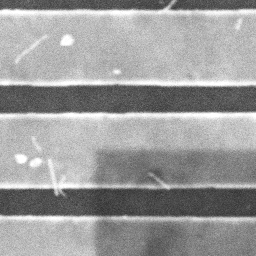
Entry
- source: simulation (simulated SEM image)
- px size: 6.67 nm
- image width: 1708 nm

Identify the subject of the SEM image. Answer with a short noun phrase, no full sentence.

lines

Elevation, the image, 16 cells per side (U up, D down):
DDDDDDDDDDDDDDDD
UUUUUUUUUUUUUUUU
UUUUUUUUUUUUUUUU
UUUUUUUUUUUUUUUU
UUUUUUUUUUUUUUUU
DDDDDDDDDDDDDDDD
DDDDDDDDDDDDDDDD
UUUUUUUUUUUUUUUU
UUUUUUUUUUUUUUUU
UUUUUUUUUUUUUUUU
UUUUUUUUUUUUUUUU
UUUUUUUUUUUUUUUU
DDDDDDDDDDDDDDDD
DDDDDDDDDDDDDDDD
UUUUUUUUUUUUUUUU
UUUUUUUUUUUUUUUU